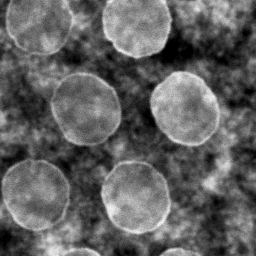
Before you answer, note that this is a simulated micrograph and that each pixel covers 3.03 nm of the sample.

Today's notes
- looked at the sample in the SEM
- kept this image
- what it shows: raised bodies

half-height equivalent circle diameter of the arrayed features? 209 nanometres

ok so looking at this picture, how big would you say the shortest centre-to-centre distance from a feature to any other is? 300 nanometers